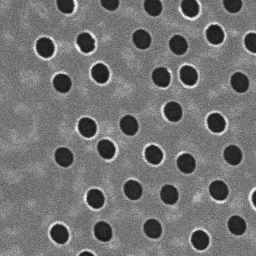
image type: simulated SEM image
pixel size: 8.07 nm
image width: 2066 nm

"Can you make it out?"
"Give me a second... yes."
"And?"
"a regular array of holes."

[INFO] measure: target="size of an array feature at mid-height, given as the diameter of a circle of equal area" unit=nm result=160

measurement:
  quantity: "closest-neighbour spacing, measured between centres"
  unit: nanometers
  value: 295